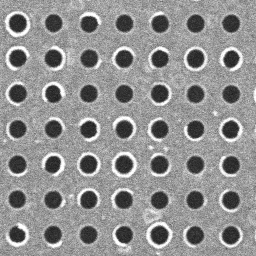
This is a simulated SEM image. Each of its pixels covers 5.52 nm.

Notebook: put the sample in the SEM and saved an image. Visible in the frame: a regular array of holes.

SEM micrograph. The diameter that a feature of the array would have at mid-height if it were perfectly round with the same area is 0.0994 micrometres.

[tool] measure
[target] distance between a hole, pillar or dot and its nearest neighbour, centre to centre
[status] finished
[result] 193 nm